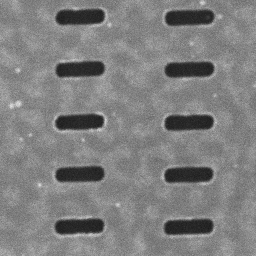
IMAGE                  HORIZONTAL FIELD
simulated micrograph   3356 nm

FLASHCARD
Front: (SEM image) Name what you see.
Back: a regular array of holes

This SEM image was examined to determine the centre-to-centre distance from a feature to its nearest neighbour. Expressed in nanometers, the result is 682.